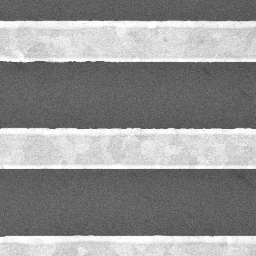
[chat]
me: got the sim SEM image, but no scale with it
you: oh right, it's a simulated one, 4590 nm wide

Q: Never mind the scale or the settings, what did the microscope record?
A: lines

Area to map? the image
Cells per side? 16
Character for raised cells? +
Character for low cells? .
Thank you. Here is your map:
................
++++++++++++++++
++++++++++++++++
++++++++++++++++
................
................
................
................
++++++++++++++++
++++++++++++++++
+++....+++++++++
................
................
................
................
++++++++++++++++